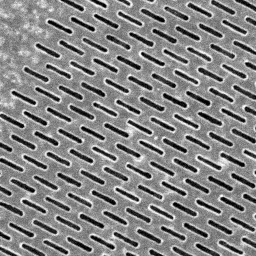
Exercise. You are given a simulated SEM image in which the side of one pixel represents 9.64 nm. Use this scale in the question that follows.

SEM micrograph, a regular array of holes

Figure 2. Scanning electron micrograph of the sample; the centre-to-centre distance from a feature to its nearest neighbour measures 222 nm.